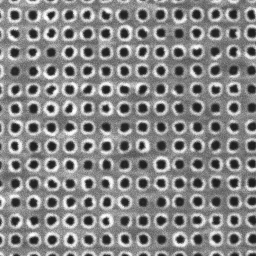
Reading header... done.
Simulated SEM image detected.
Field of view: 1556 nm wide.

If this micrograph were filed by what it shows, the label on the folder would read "a regular array of holes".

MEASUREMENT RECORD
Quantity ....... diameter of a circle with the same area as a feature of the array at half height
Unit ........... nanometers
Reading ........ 55.3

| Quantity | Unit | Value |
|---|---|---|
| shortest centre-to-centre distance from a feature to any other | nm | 109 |